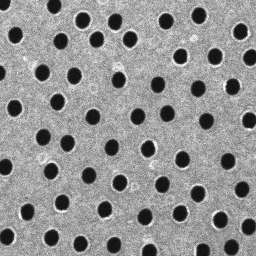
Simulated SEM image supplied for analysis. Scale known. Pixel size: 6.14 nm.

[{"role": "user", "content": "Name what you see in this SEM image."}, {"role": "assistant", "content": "a regular array of holes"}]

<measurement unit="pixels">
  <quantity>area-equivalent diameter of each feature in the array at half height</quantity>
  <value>14.6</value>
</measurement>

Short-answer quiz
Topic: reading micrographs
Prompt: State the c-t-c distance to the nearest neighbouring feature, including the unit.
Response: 194 nm